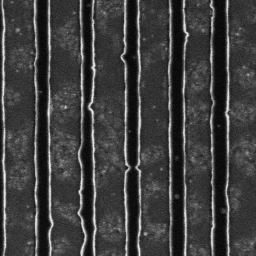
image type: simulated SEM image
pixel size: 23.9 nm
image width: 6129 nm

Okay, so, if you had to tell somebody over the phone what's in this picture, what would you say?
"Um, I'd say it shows parallel lines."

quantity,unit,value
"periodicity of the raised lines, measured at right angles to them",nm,1060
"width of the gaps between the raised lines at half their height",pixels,30.5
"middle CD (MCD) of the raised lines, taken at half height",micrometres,0.344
